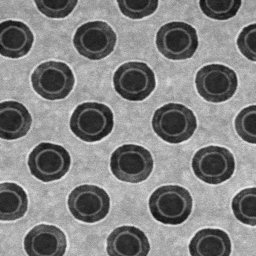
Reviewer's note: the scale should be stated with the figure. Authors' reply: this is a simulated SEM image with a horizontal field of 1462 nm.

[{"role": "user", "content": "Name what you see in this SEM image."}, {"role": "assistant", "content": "a regular array of ring-shaped grooves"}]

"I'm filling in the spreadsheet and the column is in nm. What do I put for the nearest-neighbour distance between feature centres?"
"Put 326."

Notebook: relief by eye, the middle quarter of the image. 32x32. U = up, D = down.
DUUUUUUUUUUUUUDDDDDDDUUUUUUUUUUU
DDUUUUUUUUUUUDDDUUDDDDUUUUUUUUUU
DDDUUUUUUUUUDDDUUUUUDDDUUUUUUUUU
DDDUUUUUUUUUDDUUUUUUUDDUUUUUUUUU
DDDUUUUUUUUUDDUUUUUUUDDUUUUUUUUU
DDDUUUUUUUUUDDUUUUUUDDDUUUUUUUUU
DDUUUUUUUUUUUDDUUUUUDDDUUUUUUUUU
DUUUUUUUUUUUUDDDDDDDDDUUUUUUUUUU
UUUUUUUUUUUUUUUDDDDDDUUUUUUUUUUU
UUUUUDDDUUUUUUUUUUUUUUUUUUUUUUUU
UUUDDDDDDDDUUUUUUUUUUUUUDDDDDDDU
UUDDDDUUDDDDUUUUUUUUUUUDDDDUDDDD
UUDDUUUUUDDDUUUUUUUUUUDDDUUUUUDD
UDDDUUUUUUDDUUUUUUUUUUDDUUUUUUDD
UDDUUUUUUUDDDUUUUUUUUUDDUUUUUUUD
UDDDUUUUUUDDDUUUUUUUUUDDUUUUUUDD
UUDDUUUUUDDDUUUUUUUUUUDDDUUUUUDD
UUDDDDUUDDDDUUUUUUUUUUUDDDUUUDDD
UUUDDDDDDDDUUUUUUUUUUUUUDDDDDDDD
UUUUUDDDDUUUUUUUUUUUUUUUUDDDDDUU
UUUUUUUUUUUUUUDDDDDUUUUUUUUUUUUU
DUUUUUUUUUUUUDDDDDDDDUUUUUUUUUUU
DUUUUUUUUUUUDDDUUUUDDDUUUUUUUUUU
DDUUUUUUUUUUDDUUUUUUDDUUUUUUUUUU
DDUUUUUUUUUDDDUUUUUUDDDUUUUUUUUU
DDUUUUUUUUUDDDUUUUUUDDDUUUUUUUUU
DUUUUUUUUUUDDDUUUUUUDDUUUUUUUUUU
DUUUUUUUUUUUDDDDUUUDDDUUUUUUUUUU
UUUUUUUUUUUUUDDDDDDDDUUUUUUUUUUU
UUUUUUUUUUUUUUUDDDDDUUUUUUUUUUUU
UUUDDDDDDUUUUUUUUUUUUUUUDDDDDUUU
UUDDDDDDDDUUUUUUUUUUUUUDDDDDDDDU